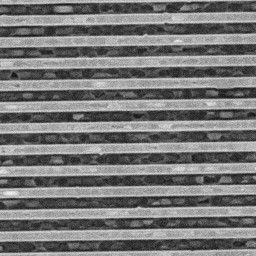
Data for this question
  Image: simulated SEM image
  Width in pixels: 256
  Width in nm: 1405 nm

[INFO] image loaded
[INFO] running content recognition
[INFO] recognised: parallel lines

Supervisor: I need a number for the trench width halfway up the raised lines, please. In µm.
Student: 0.0673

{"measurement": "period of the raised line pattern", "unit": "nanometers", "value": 118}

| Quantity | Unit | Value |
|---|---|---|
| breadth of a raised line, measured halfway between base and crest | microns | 0.0515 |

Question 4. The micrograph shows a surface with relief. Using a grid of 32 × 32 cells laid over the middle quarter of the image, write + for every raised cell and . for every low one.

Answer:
++++++++++++++++++++............
................................
................................
................................
++++++++++++++++++++++++++++++++
++++++++++++++++++++++++++++++++
................................
................................
................................
...+++++++++++++++++++++++++++++
++++++++++++++++++++++++++++++++
+++++++++++.....................
................................
................................
................++++++++++++....
++++++++++++++++++++++++++++++++
++++++++++++++++++++++++++++++++
................................
................................
................................
++++++++++++++++++++++++++++++++
++++++++++++++++++++++++++++++++
................................
................................
................................
.......+++++++++++++++++++++++++
++++++++++++++++++++++++++++++++
+++++++++++++++.................
................................
................................
................................
++++++++++++++++++++++++++++++++